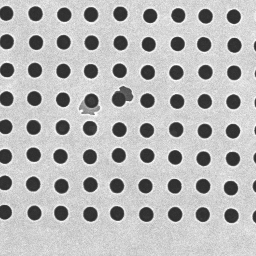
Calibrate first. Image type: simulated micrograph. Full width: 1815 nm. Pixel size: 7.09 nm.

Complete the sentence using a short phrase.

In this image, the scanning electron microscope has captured a regular array of holes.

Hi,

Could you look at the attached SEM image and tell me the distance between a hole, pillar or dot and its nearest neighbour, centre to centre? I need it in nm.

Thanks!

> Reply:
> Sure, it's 196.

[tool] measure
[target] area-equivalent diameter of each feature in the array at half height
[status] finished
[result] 14 pixels